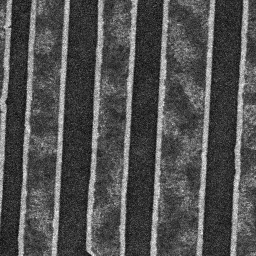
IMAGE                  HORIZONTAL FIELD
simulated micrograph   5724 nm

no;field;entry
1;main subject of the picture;one or a few lines or trenches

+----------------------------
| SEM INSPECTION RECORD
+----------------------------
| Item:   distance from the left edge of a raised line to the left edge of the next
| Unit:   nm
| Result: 1550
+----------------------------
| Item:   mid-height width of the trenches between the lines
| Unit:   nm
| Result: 745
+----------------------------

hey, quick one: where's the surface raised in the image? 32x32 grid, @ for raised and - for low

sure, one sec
@---@@@@-----@@@@----@@@@@@----@
@---@@@@-----@@@@----@@@@@-----@
@---@@@@-----@@@@----@@@@@-----@
@---@@@@-----@@@@----@@@@@-----@
@---@@@@-----@@@@----@@@@@----@@
@---@@@@-----@@@@----@@@@@-----@
@---@@@@----@@@@@----@@@@@-----@
@---@@@@----@@@@----@@@@@@----@@
@---@@@@----@@@@----@@@@@@----@@
@---@@@@----@@@@----@@@@@@----@@
@---@@@@----@@@@----@@@@@@----@@
@---@@@@----@@@@----@@@@@@----@@
----@@@@----@@@@----@@@@@@----@@
----@@@@----@@@@----@@@@@@----@@
---@@@@@----@@@@----@@@@@@----@@
---@@@@@----@@@@----@@@@@@----@@
---@@@@@----@@@@----@@@@@@----@@
---@@@@-----@@@@----@@@@@@----@@
---@@@@-----@@@@----@@@@@-----@@
---@@@@-----@@@@----@@@@@-----@@
---@@@@-----@@@@----@@@@@-----@@
---@@@@-----@@@@----@@@@@-----@@
---@@@@-----@@@@----@@@@@-----@@
---@@@@-----@@@-----@@@@@-----@@
---@@@@----@@@@-----@@@@@-----@@
---@@@@----@@@@-----@@@@@----@@@
---@@@@----@@@@-----@@@@@----@@@
---@@@@----@@@@----@@@@@@----@@@
---@@@@----@@@@----@@@@@@----@@@
---@@@@----@@@@----@@@@@@----@@@
---@@@@----@@@@----@@@@@@----@@@
---@@@@----@@@@----@@@@@@----@@@